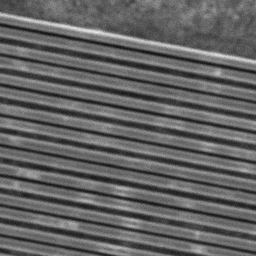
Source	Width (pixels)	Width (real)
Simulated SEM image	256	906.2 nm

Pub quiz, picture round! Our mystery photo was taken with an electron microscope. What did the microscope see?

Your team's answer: parallel lines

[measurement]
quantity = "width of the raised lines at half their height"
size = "9.35 px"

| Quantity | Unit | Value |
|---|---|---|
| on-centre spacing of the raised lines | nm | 52.1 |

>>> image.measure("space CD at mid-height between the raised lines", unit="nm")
24